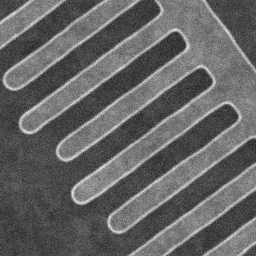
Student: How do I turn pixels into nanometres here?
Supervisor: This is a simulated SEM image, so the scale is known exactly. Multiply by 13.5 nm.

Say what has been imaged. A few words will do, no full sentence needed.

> groups of lines, slits or small figures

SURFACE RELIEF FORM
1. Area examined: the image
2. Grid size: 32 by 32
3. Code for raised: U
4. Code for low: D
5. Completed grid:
DDDUUUUDDDDDUUUUUDDDUUUUUUDDDDDD
DDUUUUDDDDDUUUUDDDDDUUUUUUUDDDDD
UUUUUDDDDDUUUUDDDDDUUUUUUUUDDDDD
UUUDDDDDUUUUUDDDDDUUUUUUUUUUDDDD
UUDDDDDUUUUDDDDDUUUUUDDUUUUUUDDD
UDDDDDUUUUDDDDDUUUUDDDDUUUUUUDDD
DDDDUUUUUDDDDDUUUUDDDDDUUUUUUUDD
DDDUUUUDDDDDUUUUUDDDDDUUUUUUUUUD
DDUUUUDDDDDUUUUDDDDDUUUUUUUUUUUU
DUUUUDDDDDUUUUDDDDDUUUUDDDUUUUUU
DUUDDDDDUUUUUDDDDDUUUUDDDDDUUUUU
DDDDDDDUUUUDDDDDUUUUDDDDDDUUUUUU
DDDDDDUUUUDDDDDUUUUDDDDDUUUUUUUU
DDDDUUUUDDDDDUUUUUDDDDDUUUUDDUUU
DDDUUUUDDDDDUUUUDDDDDUUUUUDDDDUU
DDDUUUDDDDDUUUUDDDDDUUUUDDDDDUUU
DDDUDDDDDUUUUUDDDDDUUUUDDDDDUUUU
DDDDDDDDUUUUDDDDDUUUUUDDDDDUUUUD
DDDDDDDUUUUDDDDDUUUUDDDDDUUUUUDD
DDDDDDDUUDDDDDDUUUUDDDDDUUUUDDDD
DDDDDDDDDDDDDUUUUUDDDDUUUUUDDDDD
DDDDDDDDDDDDUUUUDDDDDUUUUDDDDDDU
DDDDDDDDDDUUUUUDDDDDUUUUDDDDDUUU
DDDDDDDDDUUUUDDDDDUUUUUDDDDDUUUU
DDDDDDDDDUUUDDDDDUUUUUDDDDUUUUUD
DDDDDDDDDDDDDDDDUUUUDDDDDUUUUDDD
DDDDDDDDDDDDDDUUUUUDDDDDUUUUDDDD
DDDDDDDDDDDDDDUUUDDDDDUUUUUDDDDD
DDDDDDDDDDDDDDUUDDDDDUUUUDDDDDUU
DDDDDDDDDDDDDDDDDDDDUUUUDDDDDUUU
DDDDDDDDDDDDDDDDDDUUUUUDDDDDUUUU
DDDDDDDDDDDDDDDDDUUUUDDDDDUUUUDD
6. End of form